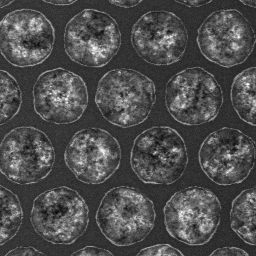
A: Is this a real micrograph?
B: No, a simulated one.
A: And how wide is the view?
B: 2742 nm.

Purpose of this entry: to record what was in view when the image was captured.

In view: a regular array of holes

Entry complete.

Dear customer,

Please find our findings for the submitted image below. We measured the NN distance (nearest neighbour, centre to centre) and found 0.708 µm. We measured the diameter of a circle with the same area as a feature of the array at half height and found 602 nm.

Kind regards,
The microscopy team